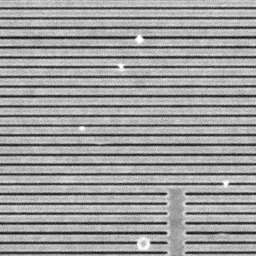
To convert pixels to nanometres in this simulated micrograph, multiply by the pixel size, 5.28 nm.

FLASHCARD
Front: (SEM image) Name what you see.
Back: parallel lines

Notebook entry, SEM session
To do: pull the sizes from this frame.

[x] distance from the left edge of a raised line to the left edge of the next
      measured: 51.7 nanometres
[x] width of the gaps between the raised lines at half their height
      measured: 15.8 nanometers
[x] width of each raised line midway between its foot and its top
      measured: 37 nanometres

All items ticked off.